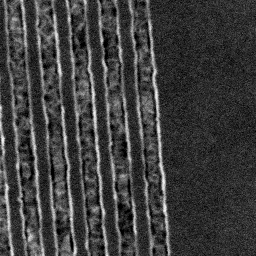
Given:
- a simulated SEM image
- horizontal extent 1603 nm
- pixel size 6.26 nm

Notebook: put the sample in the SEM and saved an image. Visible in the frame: parallel lines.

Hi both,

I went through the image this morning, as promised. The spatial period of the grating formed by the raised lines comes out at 196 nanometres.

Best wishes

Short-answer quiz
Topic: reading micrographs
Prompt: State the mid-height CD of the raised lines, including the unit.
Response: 101 nm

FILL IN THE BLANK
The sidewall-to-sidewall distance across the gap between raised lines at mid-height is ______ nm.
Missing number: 95.2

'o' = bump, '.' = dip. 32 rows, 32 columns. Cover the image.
o..oo..oo..o..oo..oooooooooooooo
o..oo..oo..oo..oo.oooooooooooooo
o..oo..oo..oo..oo..ooooooooooooo
o..oo..oo..oo..oo..ooooooooooooo
o..oo..oo..oo..oo..ooooooooooooo
o..oo..oo..oo..oo..ooooooooooooo
o..oo..oo..oo..oo..ooooooooooooo
o..oo..oo..oo..oo..ooooooooooooo
o..oo..oo..oo..oo..ooooooooooooo
o..oo..oo..oo..oo..ooooooooooooo
oo..o..oo..oo..oo..ooooooooooooo
oo..o..oo..oo..oo..ooooooooooooo
oo..o...oo..o..oo..ooooooooooooo
oo..oo..oo..oo.oo..ooooooooooooo
oo..oo..oo..oo..oo..oooooooooooo
oo..oo..oo..oo..oo..oooooooooooo
oo..oo..oo..oo..oo..oooooooooooo
oo..oo..oo..oo..oo..oooooooooooo
oo..oo..oo..oo..oo..oooooooooooo
oo..oo..oo..oo..oo..oooooooooooo
oo..oo..oo..oo..oo..oooooooooooo
.o..oooooo..oo..oo..oooooooooooo
.o..ooo.oo..oo..oo..oooooooooooo
.oo..ooooo..oo.ooo..oooooooooooo
.oo..oo..oo..o..oo..oooooooooooo
.oo..oo..oo..oo..oo.oooooooooooo
.oo..oo..oo..oo..oo.oooooooooooo
.oo..oo..oo..oo..oo..ooooooooooo
.oo..oo..oo..oo..oo..ooooooooooo
.oo..oo..oo..oo..oo..ooooooooooo
.oo..oo..oo..oo..oo..ooooooooooo
.oo..oo..oo..oo..oo..ooooooooooo